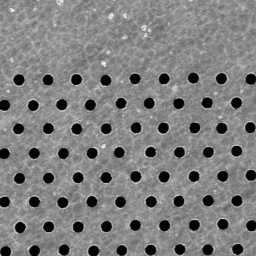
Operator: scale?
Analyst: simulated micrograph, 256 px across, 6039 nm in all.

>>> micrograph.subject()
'a regular array of holes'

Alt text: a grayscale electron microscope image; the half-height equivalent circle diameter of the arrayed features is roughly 268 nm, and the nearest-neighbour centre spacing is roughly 655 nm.